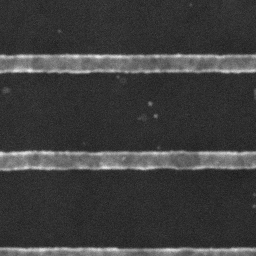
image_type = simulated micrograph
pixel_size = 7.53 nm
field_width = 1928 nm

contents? lines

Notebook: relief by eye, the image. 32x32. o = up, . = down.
................................
................................
................................
................................
................................
................................
................................
oooooooooooooooooooooooooooooooo
oooooooooooooooooooooooooooooooo
................................
................................
................................
................................
................................
................................
................................
................................
................................
................................
oooooooooooooooooooooooooooooooo
oooooooooooooooooooooooooooooooo
................................
................................
................................
................................
................................
................................
................................
................................
................................
................................
oooooooooooooooooooooooooooooooo